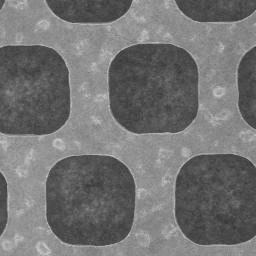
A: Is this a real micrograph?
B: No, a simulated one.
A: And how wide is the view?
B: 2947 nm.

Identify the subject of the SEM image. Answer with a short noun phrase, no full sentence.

holes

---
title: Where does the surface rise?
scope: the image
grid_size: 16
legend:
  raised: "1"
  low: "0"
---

1110000011100000
1111111111111111
1111111111111111
0000111000001110
0000111000001110
0000111000001110
0000111000001110
0000111000001110
1011111111111111
1111111111111111
1110000011100000
1110000011100000
1110000011100000
1110000011100000
1110000011100000
1111111111111111